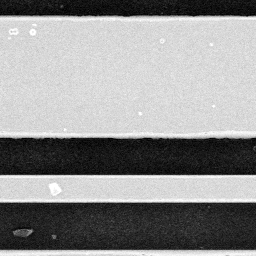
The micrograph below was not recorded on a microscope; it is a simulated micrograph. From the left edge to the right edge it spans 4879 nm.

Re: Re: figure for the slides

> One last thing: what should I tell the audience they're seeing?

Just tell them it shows lines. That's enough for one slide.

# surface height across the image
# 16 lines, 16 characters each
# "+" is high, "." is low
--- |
................
++++++++++++++++
++++++++++++++++
++++++++++++++++
++++++++++++++++
++++++++++++++++
++++++++++++++++
++++++++++++++++
++++++++++++++++
................
................
++++++++++++++++
++++++++++++++++
................
................
................